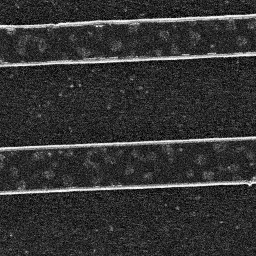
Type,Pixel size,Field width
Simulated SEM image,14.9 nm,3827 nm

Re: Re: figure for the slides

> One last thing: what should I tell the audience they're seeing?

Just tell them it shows one or a few lines or trenches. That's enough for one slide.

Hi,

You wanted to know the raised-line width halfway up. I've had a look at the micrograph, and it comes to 640 nm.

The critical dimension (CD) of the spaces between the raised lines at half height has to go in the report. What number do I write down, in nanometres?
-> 1220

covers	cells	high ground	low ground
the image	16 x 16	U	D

DDDDDDDDDDDDDDDD
DDDDUUUUUUUUUUUU
UUUUUUUUUUUUUUUU
UUUUUUUUUUUUUUDD
DDDDDDDDDDDDDDDD
DDDDDDDDDDDDDDDD
DDDDDDDDDDDDDDDD
DDDDDDDDDDDDDDDD
DDDDDDDDDDDDDDDD
UUUUUUUUUUUUUUUU
UUUUUUUUUUUUUUUU
UUUUUUUUUUUUUUDD
DDDDDDDDDDDDDDDD
DDDDDDDDDDDDDDDD
DDDDDDDDDDDDDDDD
DDDDDDDDDDDDDDDD